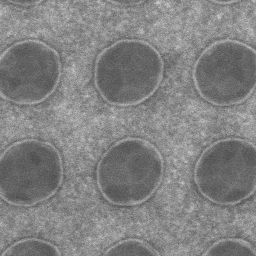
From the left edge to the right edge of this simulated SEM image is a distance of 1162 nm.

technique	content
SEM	raised bodies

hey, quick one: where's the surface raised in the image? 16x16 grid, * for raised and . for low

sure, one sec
................
................
................
****..****...***
****..****..****
***...****..****
.......*........
................
................
****...***...***
****..****..****
****..****..****
***....**....**.
................
................
.**....**....**.